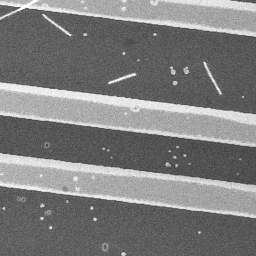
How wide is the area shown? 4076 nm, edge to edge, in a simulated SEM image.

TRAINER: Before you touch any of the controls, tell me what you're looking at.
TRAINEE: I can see lines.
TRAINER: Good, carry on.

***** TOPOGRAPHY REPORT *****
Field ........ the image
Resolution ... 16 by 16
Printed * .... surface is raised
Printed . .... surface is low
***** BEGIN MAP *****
..**************
..........******
................
................
................
**..............
**********......
..**************
...........*****
................
******..........
**************..
.......*********
...............*
................
................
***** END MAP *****